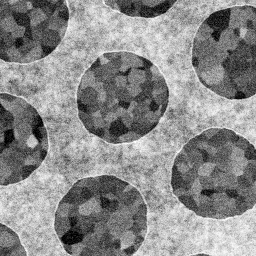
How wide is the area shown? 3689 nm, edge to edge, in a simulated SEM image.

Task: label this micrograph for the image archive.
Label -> raised bodies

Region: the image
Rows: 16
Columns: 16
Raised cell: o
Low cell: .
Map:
oooo...oooo...oo
oooo.........ooo
oooo........oooo
ooo...ooo...oooo
.....ooooo..oooo
.....oooooo..ooo
oo...oooooo.....
ooo..ooooo......
ooo...ooo...ooo.
ooo........ooooo
oo.........ooooo
o....ooo...ooooo
....ooooo..ooooo
...oooooo...ooo.
o..oooooo.......
oo..ooooo.......